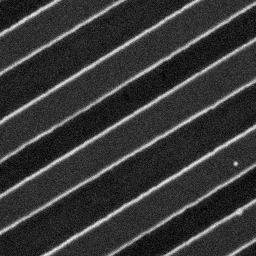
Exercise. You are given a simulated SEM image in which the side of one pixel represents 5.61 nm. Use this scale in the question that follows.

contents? lines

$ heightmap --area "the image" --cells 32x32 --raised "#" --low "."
......#########.........########
.....########.........########..
...########..........########...
.#########.........########.....
########.........#########......
#######.........########.......#
#####.........########.......###
###.........#########......#####
#..........########.......######
.........#########......########
........########.......########.
......########.......#########..
....#########......#########....
...########.......########......
.########.......#########.......
########.......########.........
######.......########..........#
####.......#########.........###
###.......########.........#####
#.......########..........######
......#########.........########
.....########.........#########.
...########..........########...
..########.........#########....
########..........########......
######..........########.......#
#####.........#########......###
###..........########.......####
#..........########.......######
.........#########.......#######
........########.......########.
......#########......#########..